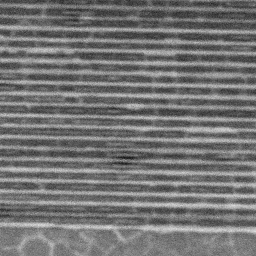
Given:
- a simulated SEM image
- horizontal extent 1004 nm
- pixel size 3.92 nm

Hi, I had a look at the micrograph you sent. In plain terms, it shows parallel lines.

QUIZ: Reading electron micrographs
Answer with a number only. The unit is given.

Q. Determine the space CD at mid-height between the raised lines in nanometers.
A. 30.9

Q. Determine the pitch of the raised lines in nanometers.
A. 43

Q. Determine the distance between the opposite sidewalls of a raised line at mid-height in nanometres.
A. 13.2